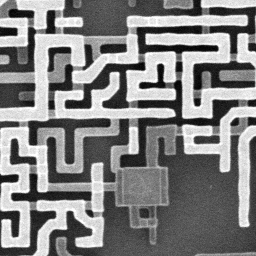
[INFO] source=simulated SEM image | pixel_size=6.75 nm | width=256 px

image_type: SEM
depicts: wiring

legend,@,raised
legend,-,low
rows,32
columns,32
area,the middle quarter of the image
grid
-------@@@----------@@@--@@@--@@
-----@@@@-----------@@@--@@@--@@
--@@@@@@@---@@--@@@@@@@--@@@--@@
--@@@@@@---@@@--@@@@@@@--@@@--@@
--@@@@@----@@@--@@@--@@--@----@@
-----------@@@--@@@-----------@@
----------@@@---@@@@@@@@@@@---@@
@@@@@--@@@@@----@@@@@@@@@@@@--@@
@@@@@--@@@@-----@@@@@@@@@@@@--@@
-------@@---------------------@@
-------@@---------------------@@
@@@@@@@@@@@@@@@@@@@@@@@@@@@---@@
@@@@@@@@@@@@@@@@@@@@@@@@@@@@--@@
--@@@@--------------------------
--------------------------------
------------------------@@@@--@@
----------------@@---@@@@@@@--@@
-----------------@---@@@@@@@--@@
-----------------@---@@--@@@--@@
-----------------@---@@--@@@--@@
----------------@@---@@--@@@--@@
----------------@@---@@--@@@--@@
---------------------@@--@@@----
---------------------@@---------
---------------------@@---------
-------@@@-----------@@@--------
-------@@----@@@@@@@@@@@@@------
-------@@----@@@@@@@@@@@@@------
-------@@----@@@@@@@@@@@@@------
-------@@----@@@@@@@@@@@@@------
-------@@@---@@@@@@@@@@@@@------
-------@@@---@@@@@@@@@@@@@------